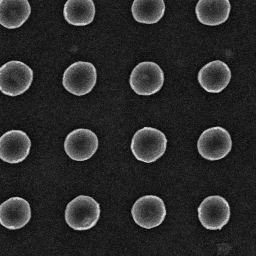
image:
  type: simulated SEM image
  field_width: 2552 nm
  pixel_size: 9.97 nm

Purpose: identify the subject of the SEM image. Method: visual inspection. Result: a regular array of raised bodies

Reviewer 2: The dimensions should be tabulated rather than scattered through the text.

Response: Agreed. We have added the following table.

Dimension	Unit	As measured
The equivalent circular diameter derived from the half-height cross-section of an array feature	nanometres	334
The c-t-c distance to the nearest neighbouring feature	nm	657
